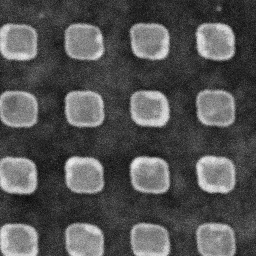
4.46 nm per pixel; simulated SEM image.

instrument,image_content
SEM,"a regular array of raised bodies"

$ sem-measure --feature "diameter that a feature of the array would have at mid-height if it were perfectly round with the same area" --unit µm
0.169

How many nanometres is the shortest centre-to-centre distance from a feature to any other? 294